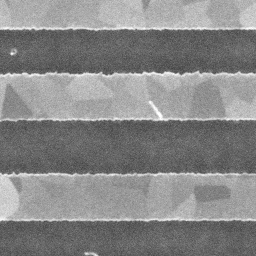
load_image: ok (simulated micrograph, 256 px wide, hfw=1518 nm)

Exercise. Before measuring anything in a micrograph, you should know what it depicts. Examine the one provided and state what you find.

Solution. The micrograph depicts lines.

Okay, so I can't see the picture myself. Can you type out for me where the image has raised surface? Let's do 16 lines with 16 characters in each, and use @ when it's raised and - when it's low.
@@@@@@@@@@@@@@@@
@@@@@@@@@@@@@@@@
----------------
----------------
----------------
@@@@@@@@@@@@@@@@
@@@@@@@@@@@@@@@@
@@@@-@----@-@---
----------------
----------------
----------------
@@@@@@@@@@@@@@@@
@@@@@@@@@@@@@@@@
@@@@@@@@@@@@@@@@
----------------
----------------